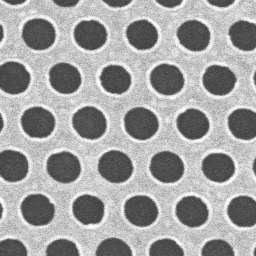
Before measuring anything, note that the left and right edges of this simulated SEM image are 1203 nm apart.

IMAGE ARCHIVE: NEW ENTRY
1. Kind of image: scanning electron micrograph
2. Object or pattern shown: a regular array of holes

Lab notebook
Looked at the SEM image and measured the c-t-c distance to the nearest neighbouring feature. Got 237 nm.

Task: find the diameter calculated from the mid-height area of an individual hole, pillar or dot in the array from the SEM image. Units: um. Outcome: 0.155